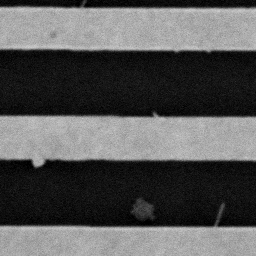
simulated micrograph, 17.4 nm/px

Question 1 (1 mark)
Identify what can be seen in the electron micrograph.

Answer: lines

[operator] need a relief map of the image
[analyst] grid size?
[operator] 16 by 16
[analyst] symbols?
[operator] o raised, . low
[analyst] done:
oooo.o..........
oooooooooooooooo
oooooooooooooooo
................
................
................
................
oooooooooooooooo
oooooooooooooooo
oooooooooooooooo
................
................
................
................
oooooooooooooooo
oooooooooooooooo